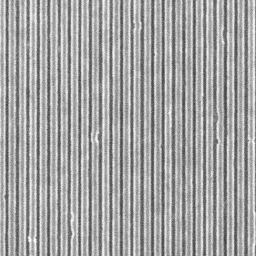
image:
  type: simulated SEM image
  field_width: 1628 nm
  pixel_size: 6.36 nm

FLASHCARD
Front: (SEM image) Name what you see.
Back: parallel lines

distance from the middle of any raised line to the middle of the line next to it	66.1	nm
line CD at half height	37.4	nm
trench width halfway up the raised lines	24.6	nm